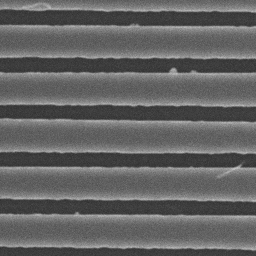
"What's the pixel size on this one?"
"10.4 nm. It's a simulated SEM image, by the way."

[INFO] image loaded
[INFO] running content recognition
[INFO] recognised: lines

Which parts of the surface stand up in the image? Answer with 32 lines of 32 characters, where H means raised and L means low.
HHHHHHHHHHHHHHHHHHHHHHHHHHHHHHHH
LLLLLLLLLLLLLLLLLLLLLLLLLLLLLLLL
LLLLLLLLLLLLLLLLLLLLLLLLLLLLLLLL
HHHHHHHHHHHHHHHHHHHHHHHHHHHHHHHH
HHHHHHHHHHHHHHHHHHHHHHHHHHHHHHHH
HHHHHHHHHHHHHHHHHHHHHHHHHHHHHHHH
HHHHHHHHHHHHHHHHHHHHHHHHHHHHHHHH
LLLLLLLLLLLLLLLLLLLLLLLLLLLLLLLL
LLLLLLLLLLLLLLLLLLLLLLLLLLLLLLLL
HHHHHHHHHHHHHHHHHHHHHHHHHHHHHHHH
HHHHHHHHHHHHHHHHHHHHHHHHHHHHHHHH
HHHHHHHHHHHHHHHHHHHHHHHHHHHHHHHH
HHHHHHHHHHHHHHHHHHHHHHHHHHHHHHHH
LLLLLLLLLLLLLLLLLLLLLLLLLLLLLLLL
LLLLLLLLLLLLLLLLLLLLLLLLLLLLLLLL
HHHHHHHHHHHHHHHHHHHHHHHHHHHHHHHH
HHHHHHHHHHHHHHHHHHHHHHHHHHHHHHHH
HHHHHHHHHHHHHHHHHHHHHHHHHHHHHHHH
HHHHHHHHHHHHHHHHHHHHHHHHHHHHHHHH
LLLLLLLLLLLLLLLLLLLLLLLLLLLLLLLL
LLLLLLLLLLLLLLLLLLLLLLLLLLLLLLLL
HHHHHHHHHHHHHHHHHHHHHHHHHHHHHHHH
HHHHHHHHHHHHHHHHHHHHHHHHHHHHHHHH
HHHHHHHHHHHHHHHHHHHHHHHHHHHHHHHH
HHHHHHHHHHHHHHHHHHHHHHHHHHHHHHHH
LLLLLLLLLLLLLLLLLLLLLLLLLLLLLLLL
LLLLLLLLLLLLLLLLLLLLLLLLLLLLLLLL
HHHHHHHHHHHHHHHHHHHHHHHHHHHHHHHH
HHHHHHHHHHHHHHHHHHHHHHHHHHHHHHHH
HHHHHHHHHHHHHHHHHHHHHHHHHHHHHHHH
HHHHHHHHHHHHHHHHHHHHHHHHHHHHHHHH
LLLLLLLLLLLLLLLLLLLLLLLLLLLLLLLL